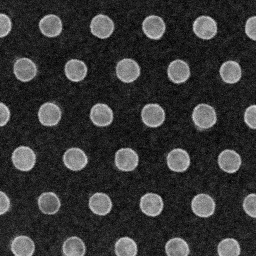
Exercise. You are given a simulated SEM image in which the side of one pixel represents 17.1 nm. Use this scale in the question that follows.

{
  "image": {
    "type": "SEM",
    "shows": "a regular array of raised bodies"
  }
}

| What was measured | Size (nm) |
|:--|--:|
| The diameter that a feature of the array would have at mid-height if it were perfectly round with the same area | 373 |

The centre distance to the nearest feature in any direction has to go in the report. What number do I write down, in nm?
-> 871